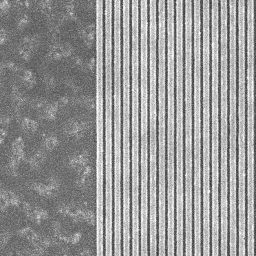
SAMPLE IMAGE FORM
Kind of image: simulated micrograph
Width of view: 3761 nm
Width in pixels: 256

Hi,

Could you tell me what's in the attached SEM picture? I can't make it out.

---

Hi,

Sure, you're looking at parallel lines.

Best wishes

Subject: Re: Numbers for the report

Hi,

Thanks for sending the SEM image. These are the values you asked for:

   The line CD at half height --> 0.079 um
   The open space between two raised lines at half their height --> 53.3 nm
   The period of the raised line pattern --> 0.131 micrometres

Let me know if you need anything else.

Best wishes